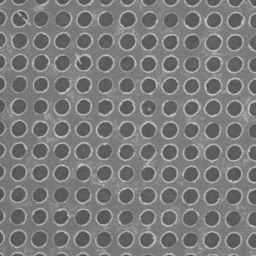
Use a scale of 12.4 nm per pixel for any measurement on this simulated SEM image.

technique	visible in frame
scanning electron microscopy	a regular array of holes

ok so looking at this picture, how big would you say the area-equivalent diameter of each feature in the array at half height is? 187 nm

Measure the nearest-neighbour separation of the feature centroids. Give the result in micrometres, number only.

0.264